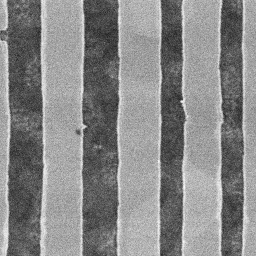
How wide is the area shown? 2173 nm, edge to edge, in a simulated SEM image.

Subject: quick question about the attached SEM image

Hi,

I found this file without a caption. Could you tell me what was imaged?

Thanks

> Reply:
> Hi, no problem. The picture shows one or a few lines or trenches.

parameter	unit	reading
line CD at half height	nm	321